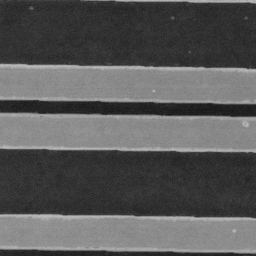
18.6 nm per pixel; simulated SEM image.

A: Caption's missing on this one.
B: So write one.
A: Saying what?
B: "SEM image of lines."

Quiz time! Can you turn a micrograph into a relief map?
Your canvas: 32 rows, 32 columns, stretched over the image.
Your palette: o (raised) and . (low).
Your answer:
................................
................................
................................
................................
................................
................................
................................
................................
oooooooooooooooooooooooo........
oooooooooooooooooooooooooooooooo
oooooooooooooooooooooooooooooooo
oooooooooooooooooooooooooooooooo
......oooooooooooooooooooooooooo
................................
ooooooooooooooooo...............
oooooooooooooooooooooooooooooooo
oooooooooooooooooooooooooooooooo
oooooooooooooooooooooooooooooooo
oooooooooooooooooooooooooooooooo
................................
................................
................................
................................
................................
................................
................................
................................
oooooooooooooooooooooooooooooooo
oooooooooooooooooooooooooooooooo
oooooooooooooooooooooooooooooooo
oooooooooooooooooooooooooooooooo
...............................o